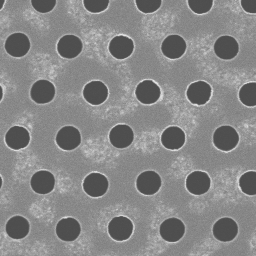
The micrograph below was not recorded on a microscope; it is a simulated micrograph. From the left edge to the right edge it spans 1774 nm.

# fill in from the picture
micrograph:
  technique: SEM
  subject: a regular array of holes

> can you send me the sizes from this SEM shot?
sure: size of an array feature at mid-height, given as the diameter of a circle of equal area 168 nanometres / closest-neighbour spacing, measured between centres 354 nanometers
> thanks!